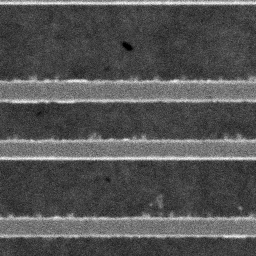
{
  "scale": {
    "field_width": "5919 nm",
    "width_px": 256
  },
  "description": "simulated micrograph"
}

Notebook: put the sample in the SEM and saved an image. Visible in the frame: lines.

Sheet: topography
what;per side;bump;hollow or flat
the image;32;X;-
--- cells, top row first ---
--------------------------------
--------------------------------
--------------------------------
--------------------------------
--------------------------------
--------------------------------
--------------------------------
--------------------------------
--------------------------------
--------------------------------
XXXXXXXXXXXXXXXXXXXXXXXXXXXXXXXX
XXXXXXXXXXXXXXXXXXXXXXXXXXXXXXXX
XXXXXXXXXXXXXXXXXXXXXXXXXXXXXXXX
--------------------------------
--------------------------------
--------------------------------
--------------------------------
--------------------------------
XXXXXXXXXXXXXXXXXXXXXXXXXXXXXXXX
XXXXXXXXXXXXXXXXXXXXXXXXXXXXXXXX
--------------------------------
--------------------------------
--------------------------------
--------------------------------
--------------------------------
--------------------------------
--------------------------------
XXXXXXXXXXXXXXXXXXXXXXXXXXXXXXXX
XXXXXXXXXXXXXXXXXXXXXXXXXXXXXXXX
XX----X-X----X------X-X---------
--------------------------------
--------------------------------